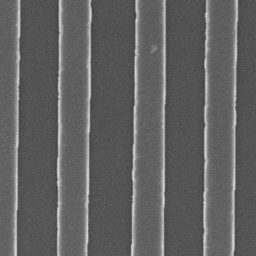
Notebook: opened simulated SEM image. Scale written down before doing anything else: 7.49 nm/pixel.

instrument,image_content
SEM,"lines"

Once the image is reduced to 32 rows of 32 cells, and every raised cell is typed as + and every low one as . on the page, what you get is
++.....++++......++++.....++++..
++......+++......++++.....++++..
++.....++++......++++.....++++..
++......+++......++++.....++++..
++......+++......++++.....++++..
++.....++++......++++.....++++..
++.....++++......++++.....+++...
++.....++++......++++.....+++...
++.....++++......++++.....+++...
++.....++++......++++.....+++...
++.....++++......++++.....+++...
++.....++++......++++.....+++...
++.....++++......++++.....+++...
++.....++++......++++.....+++...
++.....++++......++++.....+++...
++.....++++......++++.....+++...
++.....++++......++++.....+++...
++.....++++......++++.....+++...
++.....++++......++++.....+++...
++.....++++......++++.....+++...
++.....++++......++++.....+++...
++.....++++......+++......+++...
++.....++++......+++......+++...
++.....++++......+++......+++...
++.....++++......+++......+++...
++.....++++......+++......+++...
++.....++++......+++......+++...
++.....++++......+++......+++...
++.....++++......+++......+++...
++.....++++......+++......+++...
++.....++++......+++......+++...
++.....++++......+++......+++...